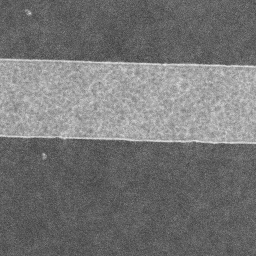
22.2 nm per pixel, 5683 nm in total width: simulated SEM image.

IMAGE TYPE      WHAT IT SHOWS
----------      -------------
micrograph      one or a few lines or trenches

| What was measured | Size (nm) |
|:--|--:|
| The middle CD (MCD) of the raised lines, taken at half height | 1580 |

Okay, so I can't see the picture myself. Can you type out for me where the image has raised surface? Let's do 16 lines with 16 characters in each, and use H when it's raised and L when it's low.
LLLLLLLLLLLLLLLL
LLLLLLLLLLLLLLLL
LLLLLLLLLLLLLLLL
LLLLLLLLLLLLLLLL
HHHHHHHHHHHHHHHH
HHHHHHHHHHHHHHHH
HHHHHHHHHHHHHHHH
HHHHHHHHHHHHHHHH
LHHHHHHHHHHHHHHH
LLLLLLLLLLLLLLLL
LLLLLLLLLLLLLLLL
LLLLLLLLLLLLLLLL
LLLLLLLLLLLLLLLL
LLLLLLLLLLLLLLLL
LLLLLLLLLLLLLLLL
LLLLLLLLLLLLLLLL